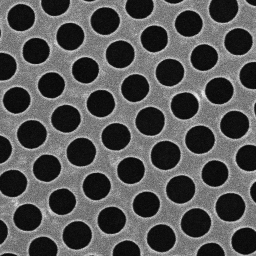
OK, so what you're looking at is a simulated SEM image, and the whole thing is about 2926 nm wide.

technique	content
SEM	a regular array of holes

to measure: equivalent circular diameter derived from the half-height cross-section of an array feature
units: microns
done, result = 0.32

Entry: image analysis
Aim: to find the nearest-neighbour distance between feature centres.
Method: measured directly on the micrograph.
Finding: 420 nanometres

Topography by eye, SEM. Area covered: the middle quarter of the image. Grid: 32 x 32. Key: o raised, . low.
oo.......ooo....ooooooo.......oo
oo.......oooooooooooooo.......oo
oo.......oooooooooooooo.......oo
ooo.....oooooooo....ooo.......oo
oooo...oooooooo......ooo.....ooo
oooooooooooooo.......oooo..ooooo
ooooooooo.oooo.......ooooooooooo
ooooooo.....oo.......ooooooo....
oooooo......ooo.....ooooooo.....
oooooo.......oooo.ooooooooo.....
..oooo.......oooooooooooooo.....
...ooo......ooooooo.....ooo.....
....ooo....ooooooo.......oo.....
....oooooooooooooo.......ooo....
....oooooooooooooo.......ooooooo
....ooooooo....ooo.......ooooooo
...ooooooo......ooo.....ooooooo.
ooooooooo........ooo....ooooooo.
oooo.oooo........ooooooooooooo..
oo.....oo.......oooooooo...ooo..
o.......oo......ooooooo......oo.
o.......oooo..oooooooo.......oo.
o.......oooooooooooooo.......ooo
o.......ooooooo...oooo.......ooo
o......ooooooo......oo.......ooo
ooo..oooooooo.......ooo.....oooo
ooooooooooooo.......oooooooooooo
oooooo....ooo.......oooooooooooo
ooooo......ooo......ooooooo.....
ooooo.......ooo...oooooooo......
ooooo.......oooooooooooooo......
.oooo.......oooooooooooooo......